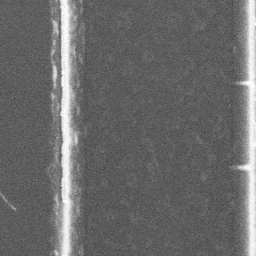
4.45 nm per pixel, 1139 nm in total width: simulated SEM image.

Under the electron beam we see one or a few lines or trenches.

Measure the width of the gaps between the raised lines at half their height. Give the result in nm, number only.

827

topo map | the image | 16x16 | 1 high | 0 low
1111000000000000
1111000000000000
1111000000000000
1111000000000000
1111000000000000
1111000000000000
1111000000000000
1111000000000000
1111000000000000
1111000000000000
1111000000000000
1111000000000000
1111000000000000
1111000000000000
1111000000000000
1111000000000000